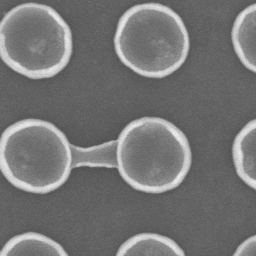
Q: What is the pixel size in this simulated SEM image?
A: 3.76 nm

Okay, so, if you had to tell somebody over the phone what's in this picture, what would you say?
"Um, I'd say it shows raised bodies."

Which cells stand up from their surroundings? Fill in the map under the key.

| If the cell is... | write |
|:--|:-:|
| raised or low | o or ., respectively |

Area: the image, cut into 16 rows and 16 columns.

.oo.....oo......
oooo...oooo....o
oooo...ooooo...o
oooo...ooooo...o
.oo......oo.....
................
................
.........o......
oooo...oooo....o
oooooooooooo...o
ooooo..ooooo...o
.ooo....ooo.....
................
................
................
oooo....ooo....o